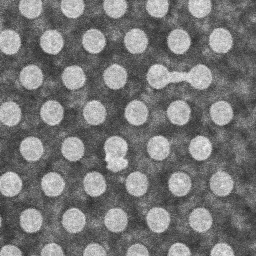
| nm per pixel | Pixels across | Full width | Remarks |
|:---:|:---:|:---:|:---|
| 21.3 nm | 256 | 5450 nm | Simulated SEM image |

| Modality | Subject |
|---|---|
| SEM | a regular array of raised bodies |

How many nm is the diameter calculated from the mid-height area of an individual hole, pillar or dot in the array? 482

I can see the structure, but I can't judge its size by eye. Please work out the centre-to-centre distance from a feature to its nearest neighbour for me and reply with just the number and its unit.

877 nm